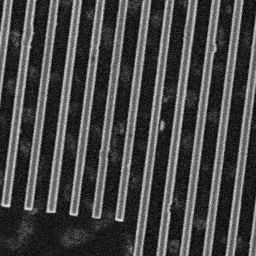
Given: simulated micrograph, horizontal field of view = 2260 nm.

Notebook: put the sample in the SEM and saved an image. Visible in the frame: parallel lines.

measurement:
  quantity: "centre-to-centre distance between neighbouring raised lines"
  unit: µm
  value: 0.202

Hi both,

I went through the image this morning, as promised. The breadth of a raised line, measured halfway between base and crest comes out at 6.94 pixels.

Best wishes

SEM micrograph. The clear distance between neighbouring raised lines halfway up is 146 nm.